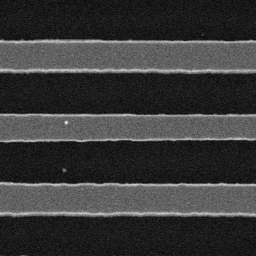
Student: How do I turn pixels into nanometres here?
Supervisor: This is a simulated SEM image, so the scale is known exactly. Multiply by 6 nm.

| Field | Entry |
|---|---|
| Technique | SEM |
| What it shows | lines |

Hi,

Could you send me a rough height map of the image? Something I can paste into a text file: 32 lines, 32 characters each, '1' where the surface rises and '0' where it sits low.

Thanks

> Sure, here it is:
00000000000000000000000000000000
00000000000000000000000000000000
00000000000000000000000000000000
00000000000000000000000000000000
00000000000000000000000000000000
11111111111111111111111111111111
11111111111111111111111111111111
11111111111111111111111111111111
11111111111111111111111111111111
00000000000000000000000000000000
00000000000000000000000000000000
00000000000000000000000000000000
00000000000000000000000000000000
00000000000000000000000000000000
11111111111111111111111111111111
11111111111111111111111111111111
11111111111111111111111111111111
11111111111111101110010000000000
00000000000000000000000000000000
00000000000000000000000000000000
00000000000000000000000000000000
00000000000000000000000000000000
00000000000000000000000000000000
11111111111111111111111111111111
11111111111111111111111111111111
11111111111111111111111111111111
11111111111111111111111111111111
00000000000000000000000000000000
00000000000000000000000000000000
00000000000000000000000000000000
00000000000000000000000000000000
00000000000000000000000000000000